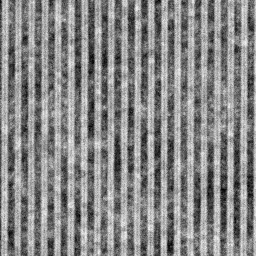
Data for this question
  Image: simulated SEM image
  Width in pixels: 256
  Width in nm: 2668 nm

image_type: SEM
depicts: parallel lines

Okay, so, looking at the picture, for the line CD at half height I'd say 54.7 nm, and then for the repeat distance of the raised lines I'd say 0.138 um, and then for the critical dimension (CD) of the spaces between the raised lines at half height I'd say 82.1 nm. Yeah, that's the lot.